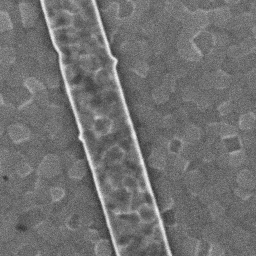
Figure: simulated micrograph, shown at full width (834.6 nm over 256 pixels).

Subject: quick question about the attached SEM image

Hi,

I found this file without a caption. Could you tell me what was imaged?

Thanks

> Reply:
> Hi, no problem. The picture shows one or a few lines or trenches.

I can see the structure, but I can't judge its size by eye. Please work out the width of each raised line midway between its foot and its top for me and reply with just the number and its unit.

0.166 um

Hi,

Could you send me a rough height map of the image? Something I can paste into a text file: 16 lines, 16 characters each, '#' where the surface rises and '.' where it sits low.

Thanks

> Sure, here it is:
...###..........
...###..........
...####.........
....###.........
....###.........
....####........
....####........
.....###........
.....###........
.....####.......
......###.......
......###.......
......####......
.......###......
.......###......
.......####.....